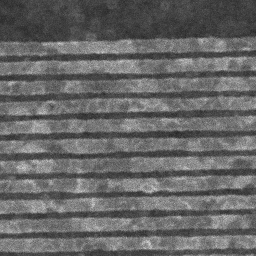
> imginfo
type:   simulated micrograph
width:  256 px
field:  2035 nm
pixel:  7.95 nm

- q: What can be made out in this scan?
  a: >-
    parallel lines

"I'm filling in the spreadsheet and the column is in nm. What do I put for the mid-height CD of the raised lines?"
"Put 90.4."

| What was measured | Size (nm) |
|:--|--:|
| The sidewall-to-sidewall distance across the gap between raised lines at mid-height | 56.6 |